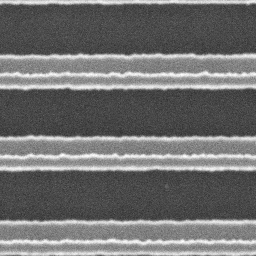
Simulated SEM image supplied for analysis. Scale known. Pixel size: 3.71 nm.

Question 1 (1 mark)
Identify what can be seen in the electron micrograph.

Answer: lines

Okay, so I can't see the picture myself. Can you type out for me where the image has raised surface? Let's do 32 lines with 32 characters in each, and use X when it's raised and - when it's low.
--------------------------------
--------------------------------
--------------------------------
--------------------------------
--------------------------------
--------------------------------
--------------------------------
XXXXXXXXXXXXXXXXXXXXXXXXXXXXXXXX
XXXXXXXXXXXXXXXXXXXXXXXXXXXXXXXX
XXXXXXXXXXXXXXXXXXXXXXXXXXXXXXXX
XXXXXXXXXXXXXXXXXXXXXXXXXXXXXXXX
--------------------------------
--------------------------------
--------------------------------
--------------------------------
--------------------------------
--------------------------------
XXXXXXXXXXXXXXXXXXXXXXXXXXXXXXXX
XXXXXXXXXXXXXXXXXXXXXXXXXXXXXXXX
XXXXXXXXXXXXXXXXXXXXXXXXXXXXXXXX
XXXXXXXXXXXXXXXXXXXXXXXXXXXXXXXX
--------------------------------
--------------------------------
--------------------------------
--------------------------------
--------------------------------
--------------------------------
--------------------------------
XXXXXXXXXXXXXXXXXXXXXXXXXXXXXXXX
XXXXXXXXXXXXXXXXXXXXXXXXXXXXXXXX
XXXXXXXXXXXXXXXXXXXXXXXXXXXXXXXX
XXXXXXXXXXXXXXXXXXXXXXXXXXXXXXXX